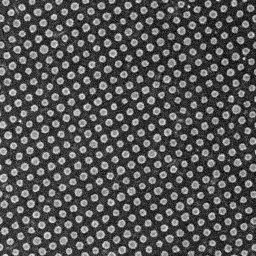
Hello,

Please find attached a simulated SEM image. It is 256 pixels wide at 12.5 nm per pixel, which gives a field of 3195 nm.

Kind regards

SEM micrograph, a regular array of raised bodies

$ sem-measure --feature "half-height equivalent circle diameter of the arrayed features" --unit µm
0.0771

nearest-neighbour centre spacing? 0.146 microns